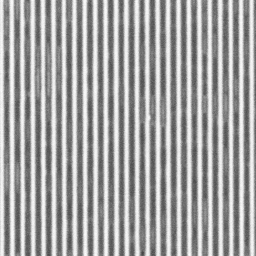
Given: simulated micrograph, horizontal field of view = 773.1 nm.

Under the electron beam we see parallel lines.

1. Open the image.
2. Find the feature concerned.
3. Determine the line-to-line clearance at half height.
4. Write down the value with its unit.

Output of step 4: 7.25 px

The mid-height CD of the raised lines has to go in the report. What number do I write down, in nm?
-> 10.9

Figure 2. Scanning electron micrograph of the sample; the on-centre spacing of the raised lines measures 31.4 nm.